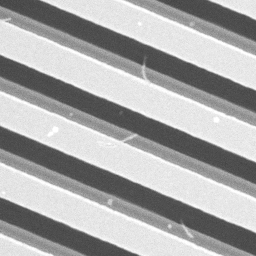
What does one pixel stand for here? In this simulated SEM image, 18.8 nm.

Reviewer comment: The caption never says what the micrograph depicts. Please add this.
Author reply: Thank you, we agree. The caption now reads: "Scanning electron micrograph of lines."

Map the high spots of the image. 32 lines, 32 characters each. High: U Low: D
DDDDDDUUUUUUUUUUUUUUDDDDDDDUUUUU
UUDDDDDDDUUUUUUUUUUUUUUDDDDDDDUU
UUUUDDDDDDDUUUUUUUUUUUUUUDDDDDDD
UUUUUUUDDDDDDDUUUUUUUUUUUUUUDDDD
UUUUUUUUUDDDDDDDUUUUUUUUUUUUUUDD
UUUUUUUUUUUDDDDDDDUUUUUUUUUUUUUU
UUUUUUUUUUUUUUDDDDDDDUUUUUUUUUUU
DDUUUUUUUUUUUUUUDDDDDDDUUUUUUUUU
DDDDUUUUUUUUUUUUUUDDDDDDDUUUUUUU
DDDDDDUUUUUUUUUUUUUUUDDDDDDDUUUU
UUDDDDDDDUUUUUUUUUUUUUUDDDDDDDUU
UUUUDDDDDDDUUUUUUUUUUUUUUDDDDDDD
UUUUUUUDDDDDDUUUUUUUUUUUUUUUDDDD
UUUUUUUUUDDDDDDDUUUUUUUUUUUUUUDD
UUUUUUUUUUUDDDDDDDUUUUUUUUUUUUUU
UUUUUUUUUUUUUUDDDDDDDUUUUUUUUUUU
DDUUUUUUUUUUUUUUDDDDDDDUUUUUUUUU
DDDDUUUUUUUUUUUUUUDDDDDDDUUUUUUU
DDDDDDDUUUUUUUUUUUUUUDDDDDDDUUUU
UUDDDDDDDUUUUUUUUUUUUUUDDDDDDDUU
UUUUUDDDDDDDUUUUUUUUUUUUUUDDDDDD
UUUUUUUDDDDDDDUUUUUUUUUUUUUUDDDD
UUUUUUUUUDDDDDDDUUUUUUUUUUUUUUDD
UUUUUUUUUUUUDDDDDDDUUUUUUUUUUUUU
UUUUUUUUUUUUUUDDDDDDDUUUUUUUUUUU
DDUUUUUUUUUUUUUUDDDDDDDUUUUUUUUU
DDDDDUUUUUUUUUUUUUUDDDDDDDUUUUUU
DDDDDDDUUUUUUUUUUUUUUDDDDDDDUUUU
UUDDDDDDDUUUUUUUUUUUUUUDDDDDDDDU
UUUUUDDDDDDDUUUUUUUUUUUUUUDDDDDD
UUUUUUUDDDDDDDUUUUUUUUUUUUUUDDDD
UUUUUUUUUDDDDDDDUUUUUUUUUUUUUUUD